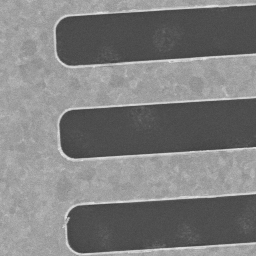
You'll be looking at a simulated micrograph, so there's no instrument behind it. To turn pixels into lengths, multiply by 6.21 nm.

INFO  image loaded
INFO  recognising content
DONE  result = one or a few lines or trenches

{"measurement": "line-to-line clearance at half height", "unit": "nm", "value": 315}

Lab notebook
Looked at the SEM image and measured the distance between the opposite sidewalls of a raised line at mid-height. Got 281 nm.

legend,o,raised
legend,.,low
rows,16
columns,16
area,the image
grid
oooooooooooo....
oooo............
ooo.............
oooo..........oo
oooooooooooooooo
oooooooooooooooo
ooooooooo.......
oooo............
oooo............
oooo........oooo
oooooooooooooooo
oooooooooooooooo
oooooooooo......
oooo............
oooo............
oooo.......ooooo